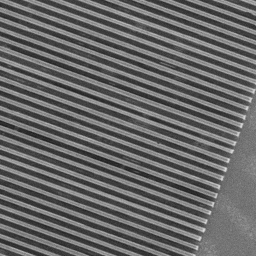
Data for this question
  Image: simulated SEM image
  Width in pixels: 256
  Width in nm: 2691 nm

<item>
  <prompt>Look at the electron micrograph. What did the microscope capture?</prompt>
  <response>parallel lines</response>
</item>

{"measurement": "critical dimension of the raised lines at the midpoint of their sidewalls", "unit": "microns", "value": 0.0358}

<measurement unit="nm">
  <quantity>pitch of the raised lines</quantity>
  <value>97.2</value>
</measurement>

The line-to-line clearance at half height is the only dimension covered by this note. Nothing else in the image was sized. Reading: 5.88 pixels